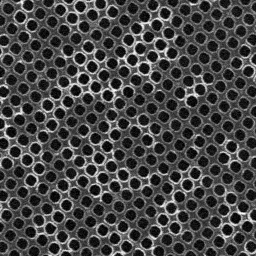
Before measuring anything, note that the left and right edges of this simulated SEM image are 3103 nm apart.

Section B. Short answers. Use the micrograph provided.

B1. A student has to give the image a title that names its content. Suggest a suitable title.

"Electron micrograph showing a regular array of holes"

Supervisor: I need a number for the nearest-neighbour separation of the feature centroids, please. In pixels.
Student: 14.1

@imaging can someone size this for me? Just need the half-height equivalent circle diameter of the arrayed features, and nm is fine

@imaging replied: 138